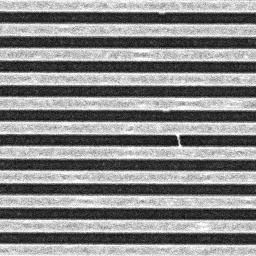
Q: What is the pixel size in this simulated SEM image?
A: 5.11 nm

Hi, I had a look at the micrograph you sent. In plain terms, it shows parallel lines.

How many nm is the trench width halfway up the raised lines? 59.4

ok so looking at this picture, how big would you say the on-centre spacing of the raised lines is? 24.5 px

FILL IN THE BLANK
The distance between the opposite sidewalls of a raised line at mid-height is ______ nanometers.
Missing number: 68.3